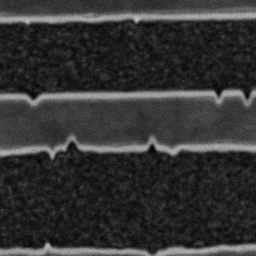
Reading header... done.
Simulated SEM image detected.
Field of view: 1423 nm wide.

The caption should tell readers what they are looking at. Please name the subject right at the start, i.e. one or a few lines or trenches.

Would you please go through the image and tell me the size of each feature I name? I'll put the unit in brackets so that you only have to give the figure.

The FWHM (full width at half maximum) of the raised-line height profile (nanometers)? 300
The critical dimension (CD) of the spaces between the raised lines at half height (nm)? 455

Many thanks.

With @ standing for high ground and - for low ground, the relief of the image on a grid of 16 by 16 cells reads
@@@@@@@@@@@@@@@@
----------------
----------------
----------------
----------------
----------------
@@@@@@@@@@@@@@@@
@@@@@@@@@@@@@@@@
@@@@@@@@@@@@@@@@
@---------------
----------------
----------------
----------------
----------------
----------------
---------------@